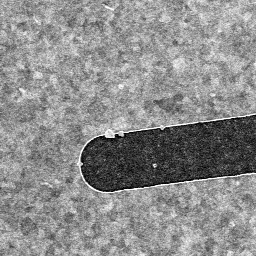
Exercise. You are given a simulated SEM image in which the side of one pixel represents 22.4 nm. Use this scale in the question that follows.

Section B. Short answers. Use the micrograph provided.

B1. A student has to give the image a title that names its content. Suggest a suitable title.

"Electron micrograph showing one or a few lines or trenches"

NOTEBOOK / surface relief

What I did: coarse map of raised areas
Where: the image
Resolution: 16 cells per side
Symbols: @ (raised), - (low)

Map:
@@@@@@@@@@@@@@@@
@@@@@@@@@@@@@@@@
@@@@@@@@@@@@@@@@
@@@@@@@@@@@@@@@@
@@@@@@@@@@@@@@@@
@@@@@@@@@@@@@@@@
@@@@@@@@@@@@@@@@
@@@@@@@@@@@@@@--
@@@@@@@---------
@@@@@-----------
@@@@@-----------
@@@@@@-----@@@@@
@@@@@@@@@@@@@@@@
@@@@@@@@@@@@@@@@
@@@@@@@@@@@@@@@@
@@@@@@@@@@@@@@@@